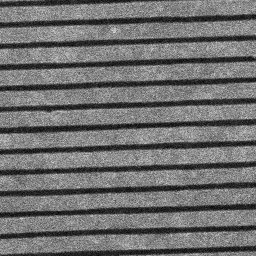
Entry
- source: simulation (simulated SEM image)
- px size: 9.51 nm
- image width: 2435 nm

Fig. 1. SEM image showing parallel lines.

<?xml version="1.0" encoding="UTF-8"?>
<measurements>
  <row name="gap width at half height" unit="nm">61.8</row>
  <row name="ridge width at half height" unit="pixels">14.9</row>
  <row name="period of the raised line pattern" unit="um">0.2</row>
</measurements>